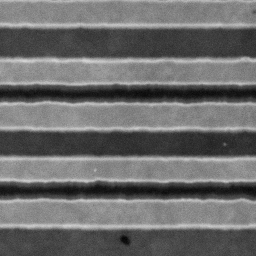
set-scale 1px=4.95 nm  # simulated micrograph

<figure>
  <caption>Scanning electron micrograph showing lines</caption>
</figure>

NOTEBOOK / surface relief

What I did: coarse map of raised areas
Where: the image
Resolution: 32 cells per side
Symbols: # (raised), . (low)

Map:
################################
################################
################################
................................
................................
................................
................................
..............................##
################################
################################
##############.###.#############
................................
................................
################################
################################
################################
................................
................................
................................
................................
################################
################################
################################
................................
................................
################################
################################
################################
................................
................................
................................
................................